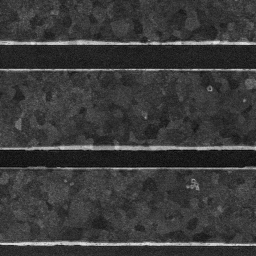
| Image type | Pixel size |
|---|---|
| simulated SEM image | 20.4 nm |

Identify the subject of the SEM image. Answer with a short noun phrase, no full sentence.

lines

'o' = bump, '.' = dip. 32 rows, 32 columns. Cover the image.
oooooooooooooooooooooooooooooooo
oooooooooooooooooooooooooooooooo
oooooooooooooooooooooooooooooooo
oooooooooooooooooooooooooooooooo
oooooooooooooooooooooooooooooooo
................................
................................
................................
................................
oooooooooooooooooooooooooooooooo
oooooooooooooooooooooooooooooooo
oooooooooooooooooooooooooooooooo
oooooooooooooooooooooooooooooooo
oooooooooooooooooooooooooooooooo
oooooooooooooooooooooooooooooooo
oooooooooooooooooooooooooooooooo
oooooooooooooooooooooooooooooooo
oooooooooooooooooooooooooooooooo
ooooooooo..ooooooooooooooooooooo
................................
................................
oooooooooooooooooooooooooooooooo
oooooooooooooooooooooooooooooooo
oooooooooooooooooooooooooooooooo
oooooooooooooooooooooooooooooooo
oooooooooooooooooooooooooooooooo
oooooooooooooooooooooooooooooooo
oooooooooooooooooooooooooooooooo
oooooooooooooooooooooooooooooooo
oooooooooooooooooooooooooooooooo
...........ooooo.o.oo.oooooooooo
................................